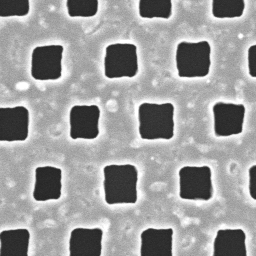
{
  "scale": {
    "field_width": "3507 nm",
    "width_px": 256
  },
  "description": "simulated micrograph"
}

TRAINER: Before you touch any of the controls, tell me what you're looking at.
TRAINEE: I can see a regular array of holes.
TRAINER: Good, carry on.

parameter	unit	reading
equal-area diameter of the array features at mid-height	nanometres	500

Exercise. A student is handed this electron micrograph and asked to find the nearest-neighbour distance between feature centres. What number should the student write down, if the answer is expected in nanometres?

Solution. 970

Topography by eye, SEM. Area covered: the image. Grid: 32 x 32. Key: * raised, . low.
....****....*****....*****.....*
...*****....*****....******...**
********************************
********************************
********************************
**************..******....******
****....*****....*****....*****.
****....*****....*****....*****.
****....*****....*****....*****.
****...******....******...******
********************************
********************************
********************************
...******...*****.....*****....*
....*****...*****.....*****....*
....*****...*****.....*****...**
....*****...*****.....*****...**
...*****************************
********************************
********************************
********************************
****....*****....*****....*****.
****....*****....*****....*****.
****....*****....*****.....****.
****....*****....******...*****.
********************************
********************************
********************************
********************************
....*****....*****....*****....*
....*****....*****....*****....*
...******....****.....*****....*